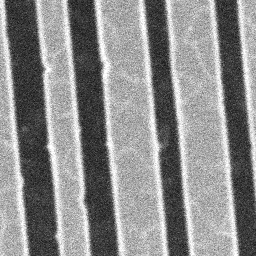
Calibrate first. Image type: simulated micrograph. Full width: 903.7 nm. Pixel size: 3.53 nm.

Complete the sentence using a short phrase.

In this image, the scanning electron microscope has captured one or a few lines or trenches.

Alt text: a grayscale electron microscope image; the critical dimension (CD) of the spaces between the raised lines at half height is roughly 0.105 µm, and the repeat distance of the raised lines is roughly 244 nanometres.